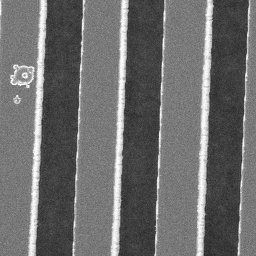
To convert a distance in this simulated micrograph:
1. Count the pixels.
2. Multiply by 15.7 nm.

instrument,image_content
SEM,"lines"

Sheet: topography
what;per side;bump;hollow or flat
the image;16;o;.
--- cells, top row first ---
ooo..ooo..ooo...
ooo..ooo..ooo...
ooo..ooo..ooo..o
ooo..ooo..ooo..o
ooo..ooo..ooo..o
ooo..ooo..ooo..o
ooo..ooo..ooo..o
oo...ooo..ooo..o
oo...ooo..ooo..o
oo...ooo..ooo..o
oo...ooo..ooo..o
oo...oo...ooo..o
oo...oo...ooo..o
oo...oo...ooo..o
oo...oo...ooo..o
oo...oo...ooo..o